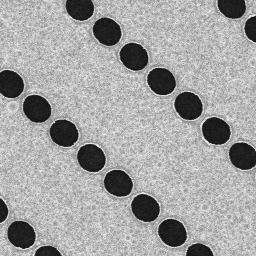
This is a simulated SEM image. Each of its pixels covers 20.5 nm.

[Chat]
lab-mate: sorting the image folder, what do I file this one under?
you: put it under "a regular array of holes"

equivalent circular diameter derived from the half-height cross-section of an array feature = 576 nanometres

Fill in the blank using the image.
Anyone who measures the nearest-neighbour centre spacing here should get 751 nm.